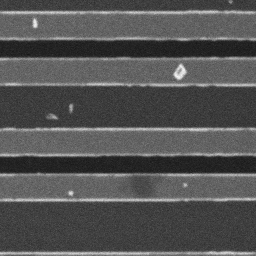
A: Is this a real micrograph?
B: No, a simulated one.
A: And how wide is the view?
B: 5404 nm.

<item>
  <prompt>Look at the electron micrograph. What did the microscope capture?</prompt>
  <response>lines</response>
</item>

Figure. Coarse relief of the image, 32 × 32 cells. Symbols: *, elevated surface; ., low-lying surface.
................................
........................*.**.*..
********************************
********************************
********************************
................................
................................
********************************
********************************
********************************
********************************
................................
................................
................................
................................
................................
********************************
********************************
********************************
................................
................................
................................
********************************
********************************
********************************
................................
................................
................................
................................
................................
................................
................................